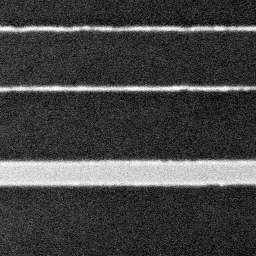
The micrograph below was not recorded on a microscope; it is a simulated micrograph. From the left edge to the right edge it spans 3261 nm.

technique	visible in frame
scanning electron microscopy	lines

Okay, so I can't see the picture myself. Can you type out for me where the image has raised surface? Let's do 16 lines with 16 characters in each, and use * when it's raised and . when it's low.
................
................
****************
****************
****************
****************
................
................
................
................
................
................
................
................
................
................